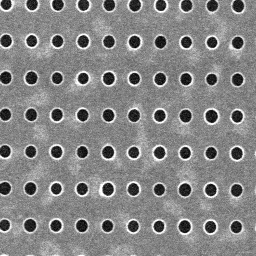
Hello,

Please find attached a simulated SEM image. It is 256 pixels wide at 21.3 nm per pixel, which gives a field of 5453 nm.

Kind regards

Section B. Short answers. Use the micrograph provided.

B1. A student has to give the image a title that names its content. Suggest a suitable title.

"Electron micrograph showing a regular array of holes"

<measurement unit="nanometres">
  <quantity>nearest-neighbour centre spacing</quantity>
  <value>547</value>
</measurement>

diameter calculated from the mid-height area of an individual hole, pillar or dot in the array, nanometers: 275